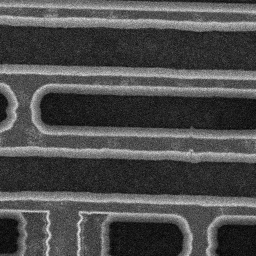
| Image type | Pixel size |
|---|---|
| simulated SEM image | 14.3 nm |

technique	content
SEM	one or a few lines or trenches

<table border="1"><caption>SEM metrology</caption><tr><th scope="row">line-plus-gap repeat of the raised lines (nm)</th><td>922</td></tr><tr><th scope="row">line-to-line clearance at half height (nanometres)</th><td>626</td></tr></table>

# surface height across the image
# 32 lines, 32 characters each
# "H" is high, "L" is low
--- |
HHHHHHHLLLLLLLLLLLLLLLLLLLLLLLLL
HHHHHHHHHHHHHHHHHHHHHHHHHHHHHHHH
LHHHHHHHHHHHHHHHHHHHHHHHHHHHHHHH
LLLLLLLLLLLLLLLLLLLLLLLLLLLLLLLL
LLLLLLLLLLLLLLLLLLLLLLLLLLLLLLLL
LLLLLLLLLLLLLLLLLLLLLLLLLLLLLLLL
LLLLLLLLLLLLLLLLLLLLLLLLLLLLLLLL
LLLLLLLLLLLLLLLLLLLLLLLLLLLLLLLL
LLLLLLLLLLLLLLLLLLLLLLLLLLLLLLLL
HHHHHHHHHHHHHHHHHHHHHHHHHHHHHHHH
HHHHHHHHHHHHHHHHHHHHHHHHHHHHHHHH
LHHHHLLLLLLLLLLLLLLLLLLLLLHHHHHH
LHHHHLLLLLLLLLLLLLLLLLLLLLLLLLLL
LHHHLLLLLLLLLLLLLLLLLLLLLLLLLLLL
LHHHHLLLLLLLLLLLLLLLLLLLLLLLLLLL
LHHHHLLLLLLLLLLLLLLLLLLLLLLLLLLL
HHHHHHHHHHHHHHHHLLLLLLLLLLLLLLLL
HHHHHHHHHHHHHHHHHHHHHHHHHHHHHHHH
HHHHHHHHHHHHHHHHHHHHHHHHHHHHHHHH
LLLLLLLLLLLLLLLLLLHLLLHHHHHHHHHH
LLLLLLLLLLLLLLLLLLLLLLLLLLLLLLLL
LLLLLLLLLLLLLLLLLLLLLLLLLLLLLLLL
LLLLLLLLLLLLLLLLLLLLLLLLLLLLLLLL
LLLLLLLLLLLLLLLLLLLLLLLLLLLLLLLL
LLLHHLLLLLLLLLLLLLLLLLLLLLLLLLLL
HHHHHHHHHHHHHHHHHHHHHHHHHHHHHHHH
HHHHHHHHHHHHHHHHHHHHHHHHHHHHHHHH
LLLHHHHHHHHHHHLLLLLLLLHHHHHHLLLL
LLLHHHHHHHHHHLLLLLLLLLLHHHHLLLLL
LLLHHHHHHHHHHLLLLLLLLLLHHHHLLLLL
LLLHHHHHHHHHHLLLLLLLLLLHHHHLLLLL
LLLHHHHHHHHHHLLLLLLLLLLHHHLLLLLL